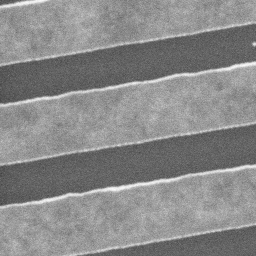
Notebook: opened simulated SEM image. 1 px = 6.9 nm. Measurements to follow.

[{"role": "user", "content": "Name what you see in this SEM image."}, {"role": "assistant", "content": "lines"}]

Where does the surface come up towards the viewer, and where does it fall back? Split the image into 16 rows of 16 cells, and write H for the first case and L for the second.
HHHHHHHHHHHHHHHH
HHHHHHHHHHHHHHHH
HHHHHHHHHHLLLLLL
HHHHLLLLLLLLLLLL
LLLLLLLLLLLLLHHH
LLLLLLLHHHHHHHHH
LHHHHHHHHHHHHHHH
HHHHHHHHHHHHHHHH
HHHHHHHHHHHLLLLL
HHHHHLLLLLLLLLLL
LLLLLLLLLLLLLLLH
LLLLLLLLLHHHHHHH
LLLHHHHHHHHHHHHH
HHHHHHHHHHHHHHHH
HHHHHHHHHHHHHLLL
HHHHHHHHLLLLLLLL